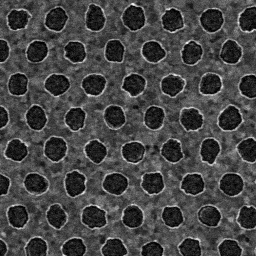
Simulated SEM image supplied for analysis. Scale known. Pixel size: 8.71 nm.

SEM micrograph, a regular array of holes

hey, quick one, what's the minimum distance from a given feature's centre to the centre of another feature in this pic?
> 0.325 µm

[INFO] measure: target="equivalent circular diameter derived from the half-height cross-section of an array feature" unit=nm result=195